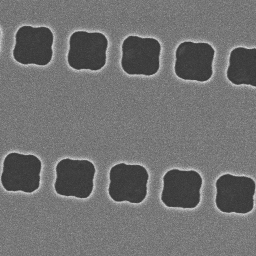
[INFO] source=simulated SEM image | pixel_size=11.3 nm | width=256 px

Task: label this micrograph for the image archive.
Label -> a regular array of holes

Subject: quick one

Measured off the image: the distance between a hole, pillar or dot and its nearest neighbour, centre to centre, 0.609 um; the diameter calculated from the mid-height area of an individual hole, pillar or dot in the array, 0.466 µm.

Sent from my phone